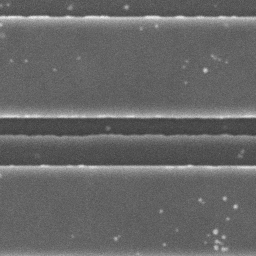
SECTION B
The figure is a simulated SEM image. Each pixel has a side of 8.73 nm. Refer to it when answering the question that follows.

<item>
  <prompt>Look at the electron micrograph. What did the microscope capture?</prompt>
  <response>lines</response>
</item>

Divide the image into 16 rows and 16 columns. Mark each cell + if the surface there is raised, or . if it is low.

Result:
................
++++++++++++++++
++++++++++++++++
++++++++++++++++
++++++++++++++++
++++++++++++++++
++++++++++++++++
................
................
................
++++++++++++++++
++++++++++++++++
++++++++++++++++
++++++++++++++++
++++++++++++++++
++++++++++++++++